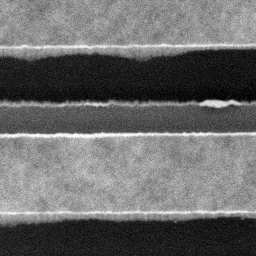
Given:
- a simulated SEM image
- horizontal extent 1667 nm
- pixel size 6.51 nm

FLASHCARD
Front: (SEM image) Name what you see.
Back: lines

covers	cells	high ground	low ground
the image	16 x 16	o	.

oooooooooooooooo
oooooooooooooooo
oooooooooooooooo
................
................
................
................
................
oooooooooooooooo
oooooooooooooooo
oooooooooooooooo
oooooooooooooooo
oooooooooooooooo
................
................
................